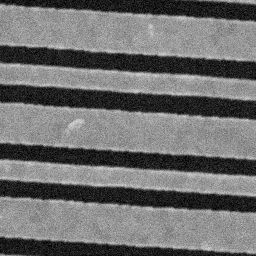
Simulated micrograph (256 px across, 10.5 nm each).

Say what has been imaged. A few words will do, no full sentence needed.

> lines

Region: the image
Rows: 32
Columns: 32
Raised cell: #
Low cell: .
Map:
................................
#############...................
############################....
################################
################################
################################
.............###################
..............................##
#######.........................
#####################...........
....############################
..................##############
................................
#########.......................
########################........
################################
################################
################################
..........######################
..........................######
######..........................
######################..........
...#############################
..................##############
................................
#############...................
#############################...
################################
################################
################################
.............###################
............................####